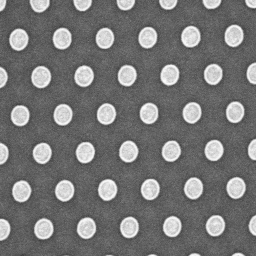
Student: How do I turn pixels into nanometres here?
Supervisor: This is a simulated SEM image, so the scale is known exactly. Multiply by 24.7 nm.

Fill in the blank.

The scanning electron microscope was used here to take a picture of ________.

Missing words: a regular array of raised bodies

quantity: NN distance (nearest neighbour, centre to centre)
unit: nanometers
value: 1060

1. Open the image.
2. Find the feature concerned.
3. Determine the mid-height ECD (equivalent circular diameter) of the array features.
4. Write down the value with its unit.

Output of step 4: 466 nm